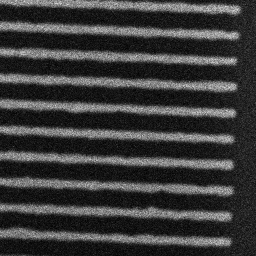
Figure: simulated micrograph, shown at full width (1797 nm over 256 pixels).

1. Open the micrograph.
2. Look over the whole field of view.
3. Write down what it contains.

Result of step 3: parallel lines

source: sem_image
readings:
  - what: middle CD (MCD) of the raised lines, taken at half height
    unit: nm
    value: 52.6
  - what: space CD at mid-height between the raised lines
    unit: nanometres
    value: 126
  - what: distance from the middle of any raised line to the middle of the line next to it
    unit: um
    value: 0.182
